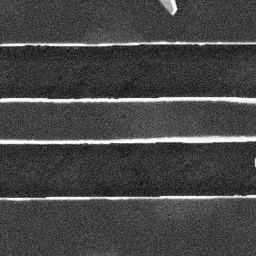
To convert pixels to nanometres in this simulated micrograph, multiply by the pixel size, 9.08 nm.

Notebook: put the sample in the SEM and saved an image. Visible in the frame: lines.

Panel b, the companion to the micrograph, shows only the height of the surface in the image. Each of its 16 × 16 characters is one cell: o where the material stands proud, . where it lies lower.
oooooooooooooooo
oooooooooooooooo
oooooooooooooooo
................
................
................
oooooooooooooooo
oooooooooooooooo
oooooooooooooooo
................
................
................
oooooooooooooooo
oooooooooooooooo
oooooooooooooooo
oooooooooooooooo